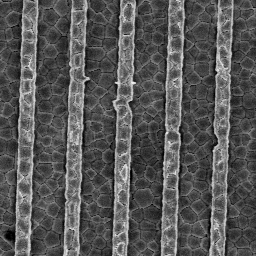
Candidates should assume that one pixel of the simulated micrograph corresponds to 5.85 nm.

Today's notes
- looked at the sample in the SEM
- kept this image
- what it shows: parallel lines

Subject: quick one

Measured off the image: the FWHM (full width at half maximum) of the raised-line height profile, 85.5 nm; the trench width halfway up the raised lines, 199 nm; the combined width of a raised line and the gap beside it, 0.285 µm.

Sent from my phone